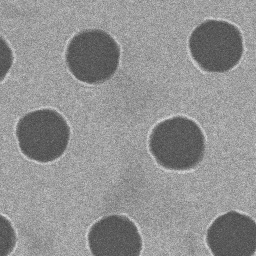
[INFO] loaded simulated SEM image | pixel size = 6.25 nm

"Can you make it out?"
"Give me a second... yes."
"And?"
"holes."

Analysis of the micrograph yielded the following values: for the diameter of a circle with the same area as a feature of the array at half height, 52.8 px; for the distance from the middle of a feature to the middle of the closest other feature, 623 nm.